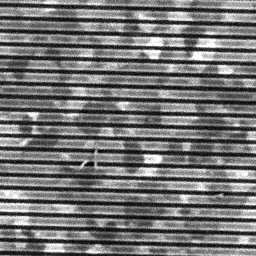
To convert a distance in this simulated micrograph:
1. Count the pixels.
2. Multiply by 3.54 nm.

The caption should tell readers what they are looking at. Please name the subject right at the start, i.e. parallel lines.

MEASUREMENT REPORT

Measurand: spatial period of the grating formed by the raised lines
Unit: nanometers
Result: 46.3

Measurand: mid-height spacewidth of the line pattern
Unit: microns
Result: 0.0204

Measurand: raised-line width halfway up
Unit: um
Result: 0.0266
